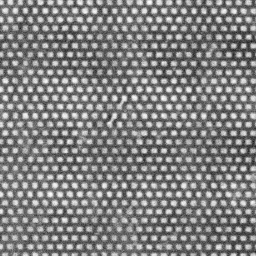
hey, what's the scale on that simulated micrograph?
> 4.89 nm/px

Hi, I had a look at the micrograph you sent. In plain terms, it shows a regular array of raised bodies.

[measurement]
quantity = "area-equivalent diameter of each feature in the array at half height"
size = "22.1 nanometers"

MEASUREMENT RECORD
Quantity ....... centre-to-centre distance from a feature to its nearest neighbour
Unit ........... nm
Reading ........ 46.5